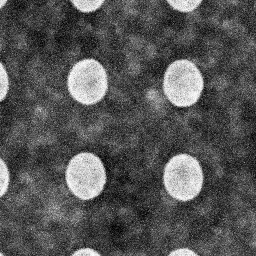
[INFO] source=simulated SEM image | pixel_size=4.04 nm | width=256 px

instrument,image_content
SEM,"raised bodies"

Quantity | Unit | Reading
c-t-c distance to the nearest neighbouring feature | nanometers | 381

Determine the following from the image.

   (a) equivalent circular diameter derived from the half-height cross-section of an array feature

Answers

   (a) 168 nanometers